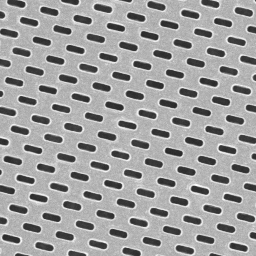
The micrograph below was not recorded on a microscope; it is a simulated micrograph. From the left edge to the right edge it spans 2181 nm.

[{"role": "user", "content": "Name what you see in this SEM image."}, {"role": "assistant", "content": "a regular array of holes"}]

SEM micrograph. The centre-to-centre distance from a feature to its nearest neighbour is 193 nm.